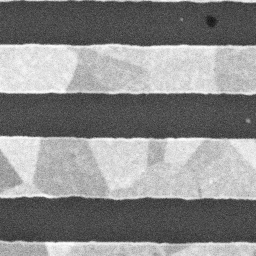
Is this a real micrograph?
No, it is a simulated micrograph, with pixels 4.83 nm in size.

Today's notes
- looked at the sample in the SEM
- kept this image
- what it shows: lines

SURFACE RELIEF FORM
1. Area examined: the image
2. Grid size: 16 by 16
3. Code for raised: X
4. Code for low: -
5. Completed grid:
----------------
----------------
----------------
XXXXXXXXXXXXXXXX
XXXXXXXXXXXXXXXX
XXXXXXXXXXXXXXXX
----------------
----------------
----------------
XXXXXXXXXXXXXXXX
XXXXXXXXXXXXXXXX
XXXXXXXXXXXXXXXX
----------------
----------------
----------------
XXXXXXXXXXXXXXXX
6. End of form